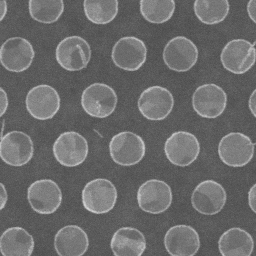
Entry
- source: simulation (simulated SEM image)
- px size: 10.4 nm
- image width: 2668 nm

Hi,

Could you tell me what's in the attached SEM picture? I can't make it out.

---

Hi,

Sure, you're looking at a regular array of raised bodies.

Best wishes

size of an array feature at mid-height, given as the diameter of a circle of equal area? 352 nanometres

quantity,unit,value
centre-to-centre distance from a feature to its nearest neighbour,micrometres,0.559